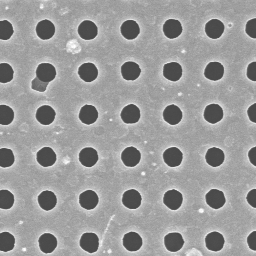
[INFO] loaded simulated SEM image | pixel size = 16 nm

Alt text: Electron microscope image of a regular array of holes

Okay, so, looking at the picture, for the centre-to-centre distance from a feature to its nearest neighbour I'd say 665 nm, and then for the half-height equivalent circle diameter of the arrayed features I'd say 320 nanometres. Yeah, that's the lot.